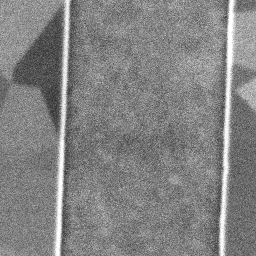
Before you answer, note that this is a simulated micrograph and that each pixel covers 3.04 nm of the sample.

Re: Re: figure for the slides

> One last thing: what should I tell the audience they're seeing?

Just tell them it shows one or a few lines or trenches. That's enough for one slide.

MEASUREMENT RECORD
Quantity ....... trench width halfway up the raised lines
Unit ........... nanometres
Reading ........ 492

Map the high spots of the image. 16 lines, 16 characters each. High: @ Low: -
@@@@----------@@
@@@@----------@@
@@@@----------@@
@@@@----------@@
@@@@----------@@
@@@@----------@@
@@@@----------@@
@@@@----------@@
@@@@----------@@
@@@@----------@@
@@@@----------@@
@@@@----------@@
@@@@----------@@
@@@@----------@@
@@@@----------@@
@@@@----------@@